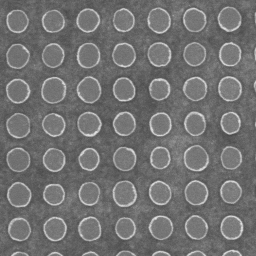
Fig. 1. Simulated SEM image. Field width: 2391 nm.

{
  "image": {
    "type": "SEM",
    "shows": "a regular array of raised bodies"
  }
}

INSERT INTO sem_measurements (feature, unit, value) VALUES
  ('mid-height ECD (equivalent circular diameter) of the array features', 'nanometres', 214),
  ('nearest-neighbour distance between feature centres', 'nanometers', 322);